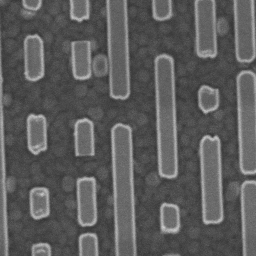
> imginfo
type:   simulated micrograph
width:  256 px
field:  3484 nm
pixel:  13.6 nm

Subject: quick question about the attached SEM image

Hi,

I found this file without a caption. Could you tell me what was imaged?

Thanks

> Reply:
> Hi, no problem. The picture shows parallel lines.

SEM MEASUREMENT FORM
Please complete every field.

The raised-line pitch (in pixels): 42.5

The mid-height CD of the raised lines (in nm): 231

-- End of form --